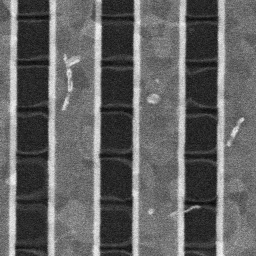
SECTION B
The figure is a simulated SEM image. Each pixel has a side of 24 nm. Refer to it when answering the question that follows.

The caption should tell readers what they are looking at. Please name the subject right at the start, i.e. wiring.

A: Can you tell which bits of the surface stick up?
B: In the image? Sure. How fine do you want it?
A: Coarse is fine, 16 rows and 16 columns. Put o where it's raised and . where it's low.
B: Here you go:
o..ooo...oo...oo
o..ooo...oo...oo
o..ooo...oo...oo
o..ooo...oo...oo
o..ooo...oo...oo
o..ooo..ooo...oo
o..ooo..ooo...oo
o..ooo..ooo...oo
o..ooo..ooo...oo
o..ooo...oo...oo
o..ooo..ooo...oo
o..ooo..ooo...oo
o..ooo..ooo...oo
o..ooo..ooo...oo
o..ooo..ooo...oo
o..ooo..ooo...oo